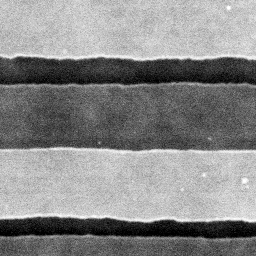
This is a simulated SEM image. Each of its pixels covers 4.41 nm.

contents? lines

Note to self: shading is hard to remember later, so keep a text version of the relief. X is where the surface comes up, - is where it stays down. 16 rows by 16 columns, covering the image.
XXXXXXXXXXXXXXXX
XXXXXXXXXXXXXXXX
XXXXXXXXXXXXXXXX
X-XXXXXXXXXXXXXX
----------------
----------------
----------------
----------------
----------------
XXXXXXXXXXXXXXXX
XXXXXXXXXXXXXXXX
XXXXXXXXXXXXXXXX
XXXXXXXXXXXXXXXX
XX--XXXXXXXXXXXX
----------------
----------------